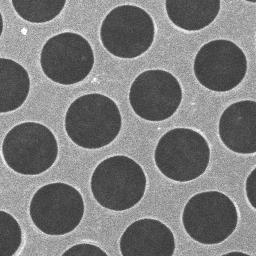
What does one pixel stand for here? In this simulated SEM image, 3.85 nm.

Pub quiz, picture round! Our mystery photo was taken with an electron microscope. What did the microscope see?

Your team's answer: a regular array of holes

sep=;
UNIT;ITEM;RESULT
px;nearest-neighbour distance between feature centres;66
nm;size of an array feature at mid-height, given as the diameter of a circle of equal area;206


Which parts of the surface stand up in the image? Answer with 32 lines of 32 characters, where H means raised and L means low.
HHLLLLLLHHHHHHHHHHHHHLLLLLLLHHHH
HHLLLLLHHHHHHHLLLLHHHLLLLLLHHHHH
HHHLLLHHHHHHHLLLLLLHHLLLLLLHHHHH
HHHHHHHHHHHHHLLLLLLHHHHLLHHHHHHH
HHHHHHHLLLHHHLLLLLLHHHHHHHHHHHHH
HHHHHHLLLLLHHLLLLLLHHHHHHHLLLHHH
HHHHHLLLLLLLHHLLLLHHHHHHHLLLLLHH
LHHHHLLLLLLLHHHHHHHHHHHHLLLLLLLH
LLLHHLLLLLLHHHHHHHHHHHHHLLLLLLLH
LLLLHHLLLLLHHHHHHLLLLLHHLLLLLLLH
LLLLHHHHLHHHHHHHHLLLLLHHHLLLLLHH
LLLLHHHHHHHHHHHHLLLLLLLHHHHHHHHH
LLLHHHHHHLLLLLHHLLLLLLLHHHHHHHHH
LLHHHHHHHLLLLLLHHLLLLLHHHHHHLLLL
HHHHHHHHLLLLLLLHHLLLLHHHHHHHLLLL
HHHLLHHHLLLLLLLHHHHHHHHHHHHLLLLL
HLLLLLHHLLLLLLLHHHHHHLLLLHHLLLLL
HLLLLLLHHLLLLLHHHHHHLLLLLLHHLLLL
LLLLLLLHHHHLHHHHHHHHLLLLLLHHHLLL
LLLLLLLHHHHHHHLHHHHLLLLLLLHHHHHH
HLLLLLLHHHHHLLLLLHHHLLLLLLHHHHHH
HHLLLHHHHHHHLLLLLLHHLLLLLHHHHHHL
HHHHHHHHHHHLLLLLLLHHHHLLHHHHHHHL
HHHHHLLLLHHLLLLLLLHHHHHHHHHHHHHL
HHHHLLLLLLHHLLLLLLHHHHHHLLLLHHHL
HHHHLLLLLLHHHLLLLHHHHHHLLLLLLHHL
LHHHLLLLLLHHHHHHHHHHHHHLLLLLLLHH
LLHHLLLLLLHHHHHHHLLLHHHLLLLLLLHH
LLLHHLLLLHHHHHHHLLLLLHHLLLLLLHHH
LLLHHHHHHHHHHHHLLLLLLLHHLLLLLHHH
LLLHHHHHHHLHHHHLLLLLLLHHHHHHHHHH
LLHHHHHHLLLLLHHLLLLLLLHHHHHHHLHH